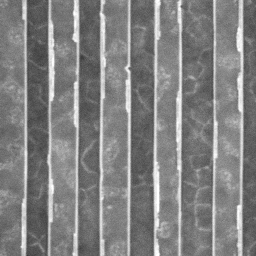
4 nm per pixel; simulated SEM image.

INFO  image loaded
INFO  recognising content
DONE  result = parallel lines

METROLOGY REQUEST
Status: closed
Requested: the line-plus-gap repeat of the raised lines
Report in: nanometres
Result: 219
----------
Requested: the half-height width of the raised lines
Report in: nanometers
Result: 114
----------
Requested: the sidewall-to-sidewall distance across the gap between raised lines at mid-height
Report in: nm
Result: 94.2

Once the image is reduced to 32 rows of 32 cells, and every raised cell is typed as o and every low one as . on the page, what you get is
ooo...oooo...ooo....ooo....ooo..
ooo...oooo...ooo....ooo....ooo..
ooo...oooo...ooo....ooo....ooo..
ooo...oooo...ooo....ooo....ooo..
ooo...oooo...ooo....ooo....ooo..
ooo...oooo...ooo....ooo....ooo..
ooo...oooo...ooo....ooo....ooo..
ooo...oooo...ooo....ooo....ooo..
ooo...oooo...ooo....ooo....ooo..
ooo...oooo...ooo...oooo....ooo..
ooo...oooo...ooo...oooo....ooo..
ooo...oooo...ooo...oooo....ooo..
ooo...oooo...ooo...oooo....ooo..
ooo...oooo...ooo...oooo....ooo..
ooo...oooo...ooo...oooo....ooo..
ooo...oooo...ooo...oooo....ooo..
ooo...oooo...ooo...oooo....ooo..
ooo...oooo...ooo...oooo....ooo..
ooo...oooo...ooo...oooo....ooo..
ooo...oooo...ooo...ooo.....ooo..
ooo...oooo...ooo...ooo.....ooo..
ooo...oooo...ooo...ooo.....ooo..
ooo...oooo...ooo...ooo.....ooo..
ooo...oooo...ooo...ooo.....ooo..
ooo...oooo...ooo...ooo.....ooo..
ooo...oooo...ooo...ooo.....ooo..
ooo...oooo...ooo...ooo.....ooo..
ooo...oooo...ooo...ooo.....ooo..
ooo...oooo...ooo...ooo.....ooo..
ooo...oooo...ooo...ooo.....ooo..
ooo...oooo...ooo...ooo.....ooo..
ooo...oooo...ooo...ooo.....ooo..